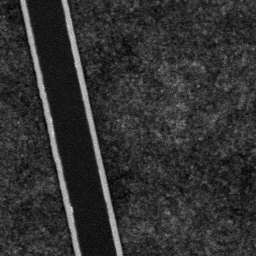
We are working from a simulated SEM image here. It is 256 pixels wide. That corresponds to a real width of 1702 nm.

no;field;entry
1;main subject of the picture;one or a few lines or trenches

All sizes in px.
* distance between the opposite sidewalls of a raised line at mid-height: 42.5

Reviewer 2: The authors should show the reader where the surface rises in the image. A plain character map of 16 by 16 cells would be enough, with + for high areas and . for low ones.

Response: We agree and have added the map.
.+++............
..++............
..+++...........
..+++...........
..+++...........
...++...........
...++...........
...+++..........
...+++..........
...+++..........
....++..........
....+++.........
....+++.........
....+++.........
.....++.........
.....++.........